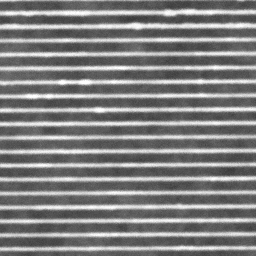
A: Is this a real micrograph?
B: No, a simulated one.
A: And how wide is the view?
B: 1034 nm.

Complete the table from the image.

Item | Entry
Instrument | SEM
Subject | parallel lines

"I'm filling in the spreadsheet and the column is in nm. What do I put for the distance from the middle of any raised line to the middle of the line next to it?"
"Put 56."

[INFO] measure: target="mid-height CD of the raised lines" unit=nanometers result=14.1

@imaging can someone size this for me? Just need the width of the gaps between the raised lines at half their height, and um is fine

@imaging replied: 0.0424